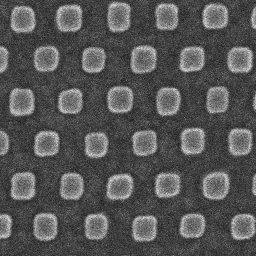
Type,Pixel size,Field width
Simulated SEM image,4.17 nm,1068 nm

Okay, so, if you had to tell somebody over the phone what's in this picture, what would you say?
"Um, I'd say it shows a regular array of raised bodies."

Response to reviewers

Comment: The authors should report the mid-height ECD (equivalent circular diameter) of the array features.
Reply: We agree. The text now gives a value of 103 nm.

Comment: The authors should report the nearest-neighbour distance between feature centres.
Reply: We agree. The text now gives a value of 196 nm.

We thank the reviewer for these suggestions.